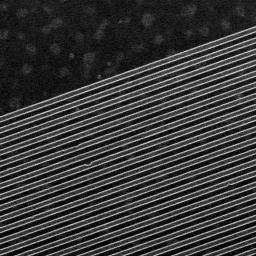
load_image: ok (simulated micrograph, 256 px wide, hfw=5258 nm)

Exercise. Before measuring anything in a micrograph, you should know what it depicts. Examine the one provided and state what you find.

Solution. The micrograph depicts parallel lines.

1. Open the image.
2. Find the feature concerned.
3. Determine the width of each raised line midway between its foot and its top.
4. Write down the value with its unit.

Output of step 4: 92 nanometres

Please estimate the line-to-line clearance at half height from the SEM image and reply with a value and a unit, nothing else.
121 nanometers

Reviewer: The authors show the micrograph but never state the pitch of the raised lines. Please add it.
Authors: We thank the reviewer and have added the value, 215 nm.